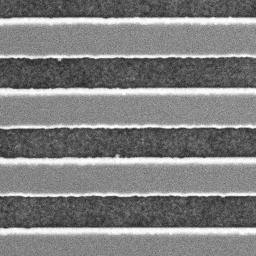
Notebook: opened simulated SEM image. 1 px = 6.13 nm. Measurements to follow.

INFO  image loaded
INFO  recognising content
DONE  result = lines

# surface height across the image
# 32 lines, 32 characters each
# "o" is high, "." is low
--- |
................................
................................
oooooooooooooooooooooooooooooooo
oooooooooooooooooooooooooooooooo
oooooooooooooooooooooooooooooooo
oooooooooooooooooooooooooooooooo
oooooooooooooooooooooooooooooooo
................................
................................
................................
................................
oooooooooooooooooooooooooooooooo
oooooooooooooooooooooooooooooooo
oooooooooooooooooooooooooooooooo
oooooooooooooooooooooooooooooooo
oooooooooooooooooooooooooooooooo
................................
................................
................................
................................
oooooooooooooooooooooooooooooooo
oooooooooooooooooooooooooooooooo
oooooooooooooooooooooooooooooooo
oooooooooooooooooooooooooooooooo
...ooooooo..oo.o.oo.............
................................
................................
................................
................................
oooooooooooooooooooooooooooooooo
oooooooooooooooooooooooooooooooo
oooooooooooooooooooooooooooooooo